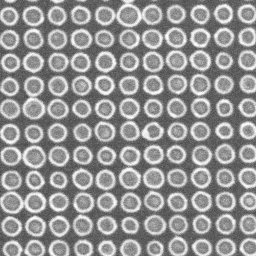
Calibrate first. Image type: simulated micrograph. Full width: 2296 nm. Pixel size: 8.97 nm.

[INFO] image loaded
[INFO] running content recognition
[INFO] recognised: a regular array of holes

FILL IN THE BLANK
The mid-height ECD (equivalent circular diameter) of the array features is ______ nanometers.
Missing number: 139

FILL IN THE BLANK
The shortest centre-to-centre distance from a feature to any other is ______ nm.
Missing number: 207